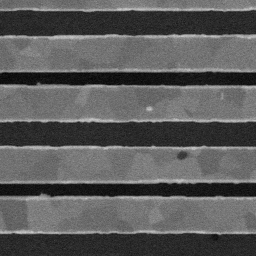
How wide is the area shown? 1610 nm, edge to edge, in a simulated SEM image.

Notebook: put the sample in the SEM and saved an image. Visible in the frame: lines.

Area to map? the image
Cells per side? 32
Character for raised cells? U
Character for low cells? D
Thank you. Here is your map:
UUUUUUUUUUUUUUUUUUUUUUUUUUUUUUUU
DDDDDDDDDDDDDDDDDDDDDDDDDDDDDDDD
DDDDDDDDDDDDDDDDDDDDDDDDDDDDDDDD
DDDDDDDDDDDDDDDDDDDDDDDDDDDDDDDD
DDDDDDDDDDUUUUUUDUDDUUUUUUUUUUUU
UUUUUUUUUUUUUUUUUUUUUUUUUUUUUUUU
UUUUUUUUUUUUUUUUUUUUUUUUUUUUUUUU
UUUUUUUUUUUUUUUUUUUUUUUUUUUUUUUU
UUUUUUUUUUUUUUUUUUUUUUUUUUUUUUUU
DDDDDDDDDDDDDDDDDDDDDDDDDDDDDDDD
DDDDDDDDDDDDDDDDDDDDDDDDDDDDDDDD
UUUUUUUUUUUUUUUUUUUUUUUUUUUUUUUU
UUUUUUUUUUUUUUUUUUUUUUUUUUUUUUUU
UUUUUUUUUUUUUUUUUUUUUUUUUUUUUUUU
UUUUUUUUUUUUUUUUUUUUUUUUUUUUUUUU
DDDDDDDDDDDDDDDDDDDDDDDDDDDDDDDD
DDDDDDDDDDDDDDDDDDDDDDDDDDDDDDDD
DDDDDDDDDDDDDDDDDDDDDDDDDDDDDDDD
UUUUUUUUUUUUUUUUUUUUUUDUUUUUUUUD
UUUUUUUUUUUUUUUUUUUUUUUUUUUUUUUU
UUUUUUUUUUUUUUUUUUUUUUUUUUUUUUUU
UUUUUUUUUUUUUUUUUUUUUUUUUUUUUUUU
UUUUUUUUUUUUUUUUUUUUUUUUUUUUUUUU
DDDDDDDDDDDDDDDDDDDDDDDDDDDDDDDD
DDDDDDDDDDDDDDDDDDDDDDDDDDDDDDDD
UUUUUUUUUUUUUUUUUUUUUUUUUUUUUUUU
UUUUUUUUUUUUUUUUUUUUUUUUUUUUUUUU
UUUUUUUUUUUUUUUUUUUUUUUUUUUUUUUU
UUUUUUUUUUUUUUUUUUUUUUUUUUUUUUUU
DDDDDDDDDDDDDDDDDDDDDDDDDDDDDDDD
DDDDDDDDDDDDDDDDDDDDDDDDDDDDDDDD
DDDDDDDDDDDDDDDDDDDDDDDDDDDDDDDD